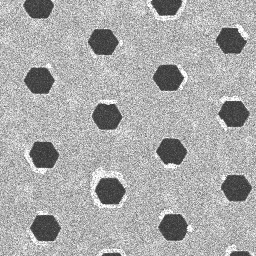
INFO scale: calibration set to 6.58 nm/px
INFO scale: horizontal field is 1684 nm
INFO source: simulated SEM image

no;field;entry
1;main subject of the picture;a regular array of holes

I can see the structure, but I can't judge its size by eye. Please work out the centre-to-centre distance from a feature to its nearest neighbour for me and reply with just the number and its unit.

480 nm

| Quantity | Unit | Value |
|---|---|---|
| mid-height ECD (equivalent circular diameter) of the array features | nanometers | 183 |